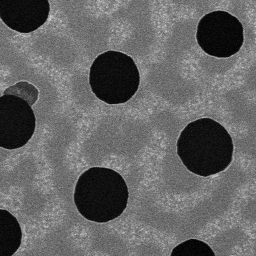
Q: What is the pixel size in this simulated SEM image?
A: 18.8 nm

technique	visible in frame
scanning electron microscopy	holes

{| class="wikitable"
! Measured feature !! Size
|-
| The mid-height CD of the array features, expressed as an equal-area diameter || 1010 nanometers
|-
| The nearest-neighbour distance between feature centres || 2140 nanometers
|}